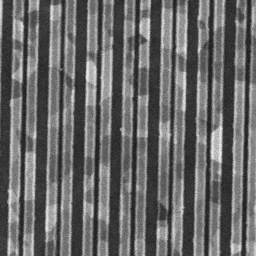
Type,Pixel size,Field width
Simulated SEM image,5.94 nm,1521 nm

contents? parallel lines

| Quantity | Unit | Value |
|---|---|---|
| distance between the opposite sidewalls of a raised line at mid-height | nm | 46.7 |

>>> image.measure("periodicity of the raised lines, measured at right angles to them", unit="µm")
0.11